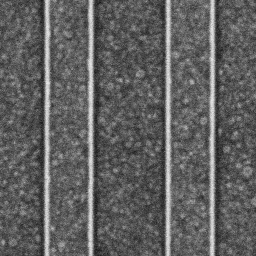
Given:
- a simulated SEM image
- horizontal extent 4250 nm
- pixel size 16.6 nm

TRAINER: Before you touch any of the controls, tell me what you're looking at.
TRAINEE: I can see one or a few lines or trenches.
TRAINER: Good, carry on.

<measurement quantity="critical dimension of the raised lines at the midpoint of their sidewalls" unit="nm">745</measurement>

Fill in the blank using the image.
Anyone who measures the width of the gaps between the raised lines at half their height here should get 1270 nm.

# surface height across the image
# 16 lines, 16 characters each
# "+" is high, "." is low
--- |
...+++.....++...
...+++.....++...
...+++.....++...
...+++.....++...
...+++.....++...
...+++.....++...
...+++.....++...
...+++.....++...
...+++.....++...
...+++.....++...
...+++.....++...
...+++.....++...
...+++.....++...
...+++.....++...
...+++.....++...
...+++.....++...